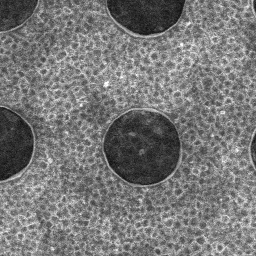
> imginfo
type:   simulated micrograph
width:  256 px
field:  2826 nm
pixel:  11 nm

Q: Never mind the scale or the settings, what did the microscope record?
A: holes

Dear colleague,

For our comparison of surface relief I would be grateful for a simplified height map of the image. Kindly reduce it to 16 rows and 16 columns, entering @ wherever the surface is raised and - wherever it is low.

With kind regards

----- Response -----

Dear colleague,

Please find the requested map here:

--@@@@@----@@@@@
-@@@@@@----@@@@@
@@@@@@@@@@@@@@@@
@@@@@@@@@@@@@@@@
@@@@@@@@@@@@@@@@
@@@@@@@@@@@@@@@@
@@@@@@@@@@@@@@@@
-@@@@@@----@@@@@
--@@@@@----@@@@@
--@@@@@----@@@@@
--@@@@@----@@@@@
@@@@@@@@--@@@@@@
@@@@@@@@@@@@@@@@
@@@@@@@@@@@@@@@@
@@@@@@@@@@@@@@@@
@@@@@@@@@@@@@@@@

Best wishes